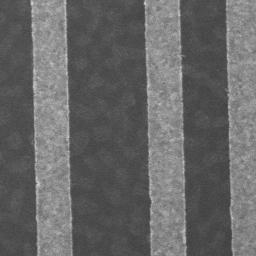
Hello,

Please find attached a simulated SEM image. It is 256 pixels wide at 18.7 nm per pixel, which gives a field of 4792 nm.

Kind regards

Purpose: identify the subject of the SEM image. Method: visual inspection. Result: one or a few lines or trenches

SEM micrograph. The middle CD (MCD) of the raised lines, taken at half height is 634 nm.